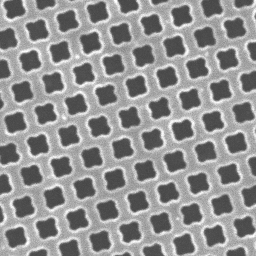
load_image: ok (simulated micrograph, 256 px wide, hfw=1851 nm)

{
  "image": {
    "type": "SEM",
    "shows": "a regular array of holes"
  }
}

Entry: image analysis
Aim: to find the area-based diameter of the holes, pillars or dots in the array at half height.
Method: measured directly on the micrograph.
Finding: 152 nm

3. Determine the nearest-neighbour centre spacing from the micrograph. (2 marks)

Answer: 227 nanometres